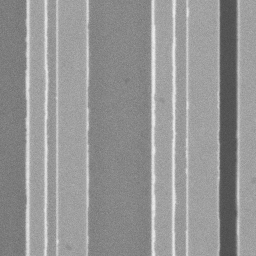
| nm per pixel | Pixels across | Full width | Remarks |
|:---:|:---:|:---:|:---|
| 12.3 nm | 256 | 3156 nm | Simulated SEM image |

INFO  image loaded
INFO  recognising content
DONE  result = lines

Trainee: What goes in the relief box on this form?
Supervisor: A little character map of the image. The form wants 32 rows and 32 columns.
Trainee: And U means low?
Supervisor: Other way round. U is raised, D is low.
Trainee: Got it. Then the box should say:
DDDDUUUUUUUDDDDDDDDUUUUUUUUDDDUU
DDDDUUUUUUUDDDDDDDDUUUUUUUUDDDUU
DDDDUUUUUUUDDDDDDDDUUUUUUUUDDDUU
DDDDUUUUUUUDDDDDDDDUUUUUUUUDDDUU
DDDDUUUUUUUDDDDDDDDUUUUUUUUDDDUU
DDDDUUUUUUUDDDDDDDDUUUUUUUUDDDUU
DDDDUUUUUUUDDDDDDDDUUUUUUUUDDDUU
DDDDUUUUUUUDDDDDDDDUUUUUUUUDDDUU
DDDDUUUUUUUDDDDDDDDUUUUUUUUDDDUU
DDDDUUUUUUUDDDDDDDDUUUUUUUUDDDUU
DDDDUUUUUUUDDDDDDDDUUUUUUUUDDDUU
DDDUUUUUUUUDDDDDDDDUUUUUUUUDDDUU
DDDDUUUUUUUDDDDDDDDUUUUUUUUDDDUU
DDDDUUUUUUUDDDDDDDDUUUUUUUUDDDUU
DDDDUUUUUUUDDDDDDDDUUUUUUUUDDDUU
DDDDUUUUUUUDDDDDDDDUUUUUUUUDDDUU
DDDDUUUUUUUDDDDDDDDUUUUUUUUDDDUU
DDDDUUUUUUUDDDDDDDDUUUUUUUUDDDUU
DDDDUUUUUUUDDDDDDDDUUUUUUUUDDDUU
DDDDUUUUUUUDDDDDDDDUUUUUUUUDDDUU
DDDDUUUUUUUDDDDDDDDUUUUUUUUDDDUU
DDDDUUUUUUUDDDDDDDDUUUUUUUUDDDUU
DDDDUUUUUUUDDDDDDDDUUUUUUUUDDDUU
DDDDUUUUUUUDDDDDDDDUUUUUUUUDDDUU
DDDDUUUUUUUDDDDDDDDUUUUUUUUDDDUU
DDDDUUUUUUUDDDDDDDDUUUUUUUUDDDUU
DDDDUUUUUUUDDDDDDDDUUUUUUUUDDDUU
DDDDUUUUUUUDDDDDDDDUUUUUUUUDDDUU
DDDDUUUUUUUDDDDDDDDUUUUUUUUDDDUU
DDDDUUUUUUUDDDDDDDDUUUUUUUUDDDUU
DDDDUUUUUUUDDDDDDDDUUUUUUUUDDDUU
DDDDUUUUUUUDDDDDDDDUUUUUUUUDDDUU